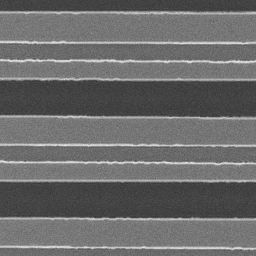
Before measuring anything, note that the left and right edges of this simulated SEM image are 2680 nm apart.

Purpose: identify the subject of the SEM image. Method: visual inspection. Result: lines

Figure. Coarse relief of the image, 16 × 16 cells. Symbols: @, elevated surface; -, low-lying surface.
----------------
@@@@@@@@@@@@@@@@
@@@@@@@@@@@@@@@@
@@@@@@@@@@@@@@@@
@@@@@@@@@@@@@@@@
----------------
----------------
@@@@@@@@@@@@@@@@
@@@@@@@@@@@@@@@@
@@@@@@@@@@@@@@@@
@@@@@@@@@@@@@@@@
----------------
----------------
----------------
@@@@@@@@@@@@@@@@
@@@@@@@@@@@@@@@@